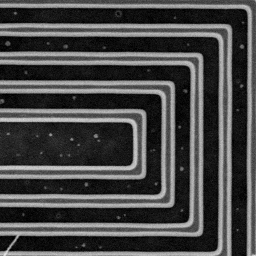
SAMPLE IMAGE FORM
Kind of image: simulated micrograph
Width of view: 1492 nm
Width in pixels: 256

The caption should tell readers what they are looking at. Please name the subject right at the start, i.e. groups of lines, slits or small figures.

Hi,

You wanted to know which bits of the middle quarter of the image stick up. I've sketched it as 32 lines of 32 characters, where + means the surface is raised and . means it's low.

................................
................................
................................
................................
................................
+++++++++++++++++++++++++++.....
+++++++++++++++++++++++++++.....
........................+++.....
.........................++.....
.........................++.....
.........................++.....
.........................++.....
++++++++++++++++++++.....++.....
++++++++++++++++++++.....++.....
.................+++.....++.....
.................+++.....++.....
..................++.....++.....
..................++.....++.....
..................++.....++.....
..................++.....++.....
..................++.....++.....
..................++.....++.....
..................++.....++.....
..................++.....++.....
..................++.....++.....
.................+++.....++.....
++++++++++++++++++++.....++.....
++++++++++++++++++++.....++.....
.........................++.....
.........................++.....
.........................++.....
.........................++.....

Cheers